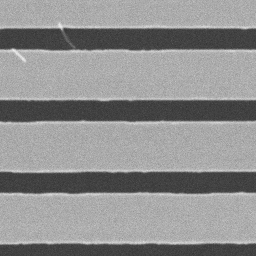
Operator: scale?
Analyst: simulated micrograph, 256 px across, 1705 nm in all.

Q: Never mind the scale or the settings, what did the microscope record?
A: lines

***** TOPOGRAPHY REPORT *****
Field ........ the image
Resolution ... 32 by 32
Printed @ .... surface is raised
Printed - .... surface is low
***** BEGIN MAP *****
@@@@@@@@@@@@@@@@@@@@@@@@@@@@@@@@
@@@@@@@@@@@@@@@@@@@@@@@@@@@@@@@@
@@@@@@@@@@@@@@@@@@@@@@@@@@@@@@@@
@------@----------------------@-
--------------------------------
--------------------------------
@@@@@@@@@@@@@@@@@@@@@@@@@@@@@@@@
@@@@@@@@@@@@@@@@@@@@@@@@@@@@@@@@
@@@@@@@@@@@@@@@@@@@@@@@@@@@@@@@@
@@@@@@@@@@@@@@@@@@@@@@@@@@@@@@@@
@@@@@@@@@@@@@@@@@@@@@@@@@@@@@@@@
@@@@@@@@@@@@@@@@@@@@@@@@@@@@@@@@
---@-@@@@---@@--@-------------@-
--------------------------------
--------------------------------
@@@@@@@@@@@@@@@@@@@@@@@@@@@@@@@@
@@@@@@@@@@@@@@@@@@@@@@@@@@@@@@@@
@@@@@@@@@@@@@@@@@@@@@@@@@@@@@@@@
@@@@@@@@@@@@@@@@@@@@@@@@@@@@@@@@
@@@@@@@@@@@@@@@@@@@@@@@@@@@@@@@@
@@@@@@@@@@@@@@@@@@@@@@@@@@@@@@@@
-@@@@@@@@@@--@@@-@@-----@@------
--------------------------------
--------------------------------
@@@@@@@@@@@@@@@@@@@@@@@@@@@@@@@@
@@@@@@@@@@@@@@@@@@@@@@@@@@@@@@@@
@@@@@@@@@@@@@@@@@@@@@@@@@@@@@@@@
@@@@@@@@@@@@@@@@@@@@@@@@@@@@@@@@
@@@@@@@@@@@@@@@@@@@@@@@@@@@@@@@@
@@@@@@@@@@@@@@@@@@@@@@@@@@@@@@@@
--------------------------------
--------------------------------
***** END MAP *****